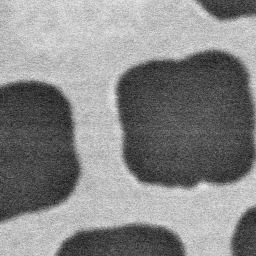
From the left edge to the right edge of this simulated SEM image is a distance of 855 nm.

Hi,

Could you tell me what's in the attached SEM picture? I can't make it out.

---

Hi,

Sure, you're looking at holes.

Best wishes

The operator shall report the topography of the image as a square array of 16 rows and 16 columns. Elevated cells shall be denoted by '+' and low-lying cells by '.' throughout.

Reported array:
+++++++++++++...
++++++++++++++++
++++++++++++++++
++++++++++++...+
++++++++........
....+++.........
....+++.........
.....++.........
.....+++........
.....+++........
.....+++........
.....++++......+
....++++++++++++
.++++++++++++++.
+++++......++++.
++++........++..